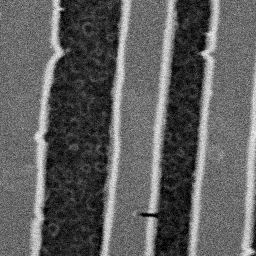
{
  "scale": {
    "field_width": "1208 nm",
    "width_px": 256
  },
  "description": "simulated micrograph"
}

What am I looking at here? one or a few lines or trenches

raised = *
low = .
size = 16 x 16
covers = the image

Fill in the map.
****....***..***
***.....***..***
***.....**...***
****....**...***
***.....**...***
***....***...***
***....***...***
***....***...***
***....***...***
***....***...***
***....***...***
***....***..****
**.....***..****
**.....**...****
**.....**...***.
**.....**...***.